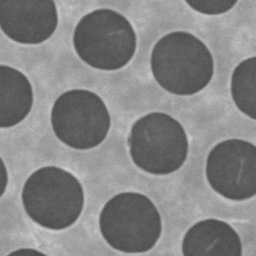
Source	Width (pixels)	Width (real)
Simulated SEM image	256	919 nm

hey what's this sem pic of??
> holes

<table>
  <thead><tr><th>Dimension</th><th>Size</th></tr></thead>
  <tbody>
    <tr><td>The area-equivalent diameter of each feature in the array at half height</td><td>223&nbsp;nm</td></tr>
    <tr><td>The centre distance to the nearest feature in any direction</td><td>0.291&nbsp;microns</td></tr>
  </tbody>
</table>